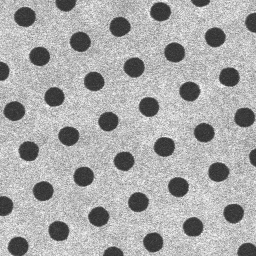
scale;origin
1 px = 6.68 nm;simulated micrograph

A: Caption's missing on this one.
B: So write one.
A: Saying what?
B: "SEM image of a regular array of holes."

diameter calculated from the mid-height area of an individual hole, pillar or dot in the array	134	nanometers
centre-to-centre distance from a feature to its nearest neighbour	282	nm